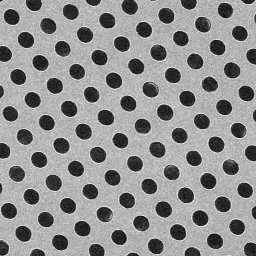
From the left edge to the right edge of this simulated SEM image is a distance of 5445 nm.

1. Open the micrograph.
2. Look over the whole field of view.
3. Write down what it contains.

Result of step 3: a regular array of holes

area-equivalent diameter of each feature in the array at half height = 351 nm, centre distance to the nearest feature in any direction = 559 nm